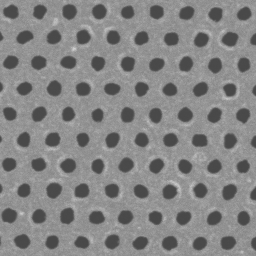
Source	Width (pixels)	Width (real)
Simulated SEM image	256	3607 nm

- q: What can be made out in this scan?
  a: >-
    a regular array of holes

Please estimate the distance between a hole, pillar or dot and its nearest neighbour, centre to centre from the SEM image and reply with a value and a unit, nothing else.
402 nm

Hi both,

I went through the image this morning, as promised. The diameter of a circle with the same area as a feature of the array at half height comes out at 0.205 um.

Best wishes